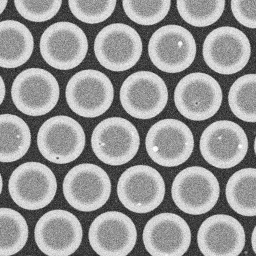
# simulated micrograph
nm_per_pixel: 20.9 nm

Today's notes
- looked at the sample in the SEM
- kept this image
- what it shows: an array of small figures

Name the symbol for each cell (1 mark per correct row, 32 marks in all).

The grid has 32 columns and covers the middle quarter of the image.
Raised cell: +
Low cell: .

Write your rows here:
+++.......+++++++......++++++++.
............+++.........++++++..
...+++++++.......++++++.........
..+++++++++.....++++++++......++
.+++++++++++...++++++++++....+++
.+++++++++++...++++++++++...++++
.+++++++++++..++++++++++++..++++
.+++++++++++..++++++++++++..++++
.+++++++++++..++++++++++++..++++
.+++++++++++..++++++++++++..++++
.++++++++++....++++++++++...++++
..+++++++++....++++++++++....+++
...++++++.......+++++++......+++
++..........+.....++++.........+
+++......+++++++........+++++...
++++....+++++++++.....+++++++++.
+++++...++++++++++...++++++++++.
+++++..++++++++++++..+++++++++++
+++++..++++++++++++..+++++++++++
+++++..++++++++++++..+++++++++++
+++++..++++++++++++..+++++++++++
+++++..+++++++++++...+++++++++++
++++....++++++++++...+++++++++++
+++......++++++++.....+++++++++.
+.........++++++.......+++++++..
...+++++..........+++......+....
..++++++++......+++++++.......++
.++++++++++....+++++++++.....+++
+++++++++++...++++++++++....++++
+++++++++++...+++++++++++..+++++
++++++++++++.++++++++++++..+++++
++++++++++++.++++++++++++..+++++